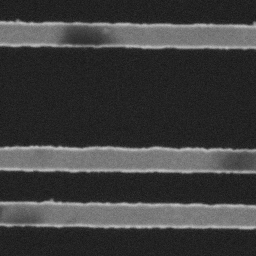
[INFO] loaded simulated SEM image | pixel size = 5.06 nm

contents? lines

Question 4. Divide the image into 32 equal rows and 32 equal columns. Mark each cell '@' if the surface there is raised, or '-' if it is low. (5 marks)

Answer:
--------------------------------
--------------------------------
--------------------------------
@@@@@@@@@@@@@@@@@@@@@@@@@@@@@@@@
@@@@@@@@@@@@@@@@@@@@@@@@@@@@@@@@
@@@@@@@@@@@@@@@@@@@@@@@@@@@@@@@@
--------------------------------
--------------------------------
--------------------------------
--------------------------------
--------------------------------
--------------------------------
--------------------------------
--------------------------------
--------------------------------
--------------------------------
--------------------------------
--------------------------------
@@@@@@@@@--@@@@----@------------
@@@@@@@@@@@@@@@@@@@@@@@@@@@@@@@@
@@@@@@@@@@@@@@@@@@@@@@@@@@@@@@@@
---------------------------@@@@@
--------------------------------
--------------------------------
--------------------------------
@@@@@@@@@@-@@@-@----------------
@@@@@@@@@@@@@@@@@@@@@@@@@@@@@@@@
@@@@@@@@@@@@@@@@@@@@@@@@@@@@@@@@
-----------------------------@@@
--------------------------------
--------------------------------
--------------------------------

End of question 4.